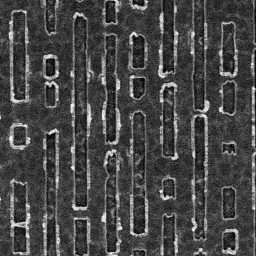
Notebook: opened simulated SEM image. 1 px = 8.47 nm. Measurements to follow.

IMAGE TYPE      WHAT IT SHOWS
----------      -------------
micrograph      parallel lines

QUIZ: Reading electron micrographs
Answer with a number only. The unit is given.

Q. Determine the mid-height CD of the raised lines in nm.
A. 159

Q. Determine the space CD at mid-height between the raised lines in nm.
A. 98.4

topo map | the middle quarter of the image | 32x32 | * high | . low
**....****...****...*****...****
**....****...************...****
**....****...*******************
**....****...****...************
**....****...****...************
**....****...****...************
**....*****..****...*****...****
**....*****..****...*****...****
**....*****..****..******...****
**....*****..************...****
**....*****..************...****
**....****...************..*****
**....****...****...*****..*****
**....****...****...*****...****
***...****...****...*****...****
***...****...****...*****...****
***...****...****...*****...****
***...****...****...*****...****
***...****...****...*****...****
***...***********...*****...****
***...***********...*****...****
***...***********...*****...****
***...******.****...*****...****
***...*****..****...************
***...*****..****...************
***...****...****...************
***...*****..****...************
***...*****..****...************
***...*****..****...************
***...*****..****...*****...****
***...****...****...*****...****
***...****...****...*****...****